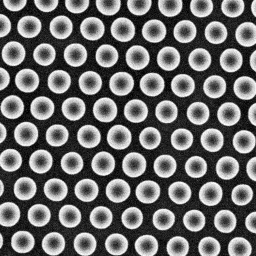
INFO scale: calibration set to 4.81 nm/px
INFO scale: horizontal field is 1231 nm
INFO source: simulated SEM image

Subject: an array of small figures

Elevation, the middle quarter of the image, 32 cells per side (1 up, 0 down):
00100000011100001111100011110000
00000000000000000000000001100000
10000111000001110000011000000000
11001111100011111000111110011111
11001111100011111001111110011111
10001111100111111001111110011111
10001111100011111001111110011111
00000001000001110000111100001111
01110000010000000000000000000000
11111000111110001111000011100000
11111001111110011111000111110001
11111001111110011111100111110001
11111000111110011111100111110001
01110000111110001111000111110001
00000000000000000110000011100000
00000110000001100000000000000000
10001111000111110000111000001110
10011111100111111001111100011111
10011111100111111001111100011111
00001111100111111001111100011111
00000111000011110000111000011111
00000000000000000000000000000000
01100000111100001110000000000000
11110001111100011111000111100000
11111001111110011111000111110001
11111001111110011111000111110011
11110001111100011111000111110011
01100000111000011110000111100001
00000000000000000000000000000000
00001111000011100000110000000000
10011111000111110011111100011110
10011111000111110011111100111111